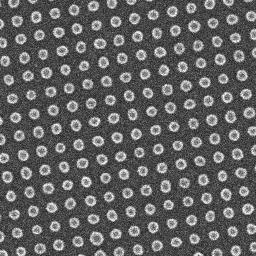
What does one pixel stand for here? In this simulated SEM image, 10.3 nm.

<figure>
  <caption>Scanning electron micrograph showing a regular array of raised bodies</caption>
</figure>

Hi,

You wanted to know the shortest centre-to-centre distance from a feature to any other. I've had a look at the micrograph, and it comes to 18.6 px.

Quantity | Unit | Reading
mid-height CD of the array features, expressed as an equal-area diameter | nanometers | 95.2